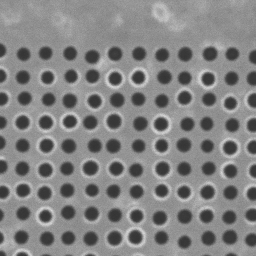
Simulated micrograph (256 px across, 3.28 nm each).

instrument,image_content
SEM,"a regular array of holes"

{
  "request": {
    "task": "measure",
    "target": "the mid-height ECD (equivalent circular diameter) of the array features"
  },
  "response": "45.6 nm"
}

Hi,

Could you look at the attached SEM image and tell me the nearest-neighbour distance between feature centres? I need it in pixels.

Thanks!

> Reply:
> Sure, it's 21.6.